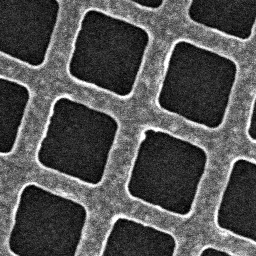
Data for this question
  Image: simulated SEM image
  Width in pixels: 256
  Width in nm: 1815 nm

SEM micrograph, holes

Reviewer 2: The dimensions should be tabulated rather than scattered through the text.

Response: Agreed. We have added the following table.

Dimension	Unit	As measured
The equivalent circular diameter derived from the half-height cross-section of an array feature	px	77.8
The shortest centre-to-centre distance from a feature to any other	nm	659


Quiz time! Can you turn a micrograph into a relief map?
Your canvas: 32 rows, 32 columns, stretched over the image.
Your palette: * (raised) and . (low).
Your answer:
.......**********...****........
.......****..***********........
.......***.....*********........
.......***........********......
.......***.........**********..*
......***.........****..********
......***.........***......*****
**....***.........***........***
*********........****.........**
*********........****........***
..*********......***.........***
....**********..****.........***
....***..***********.........***
...****....*********........****
...***........*********.....***.
...***.........**********...***.
..****.........***..***********.
..***.........****.....*********
..***.........***........*******
*****.........***.........******
*****........****.........***...
*******......***.........****...
**********...***.........****...
***..***********.........***....
***.....*********.......****....
**........*********.....****....
**.........**********...***.....
**.........****.***********.....
**........****.....*********....
*.........****.......*********..
*.........***.........**********
**.......****.........***...****